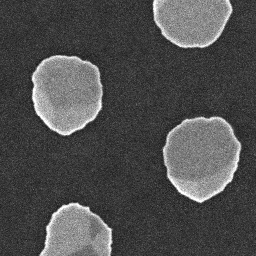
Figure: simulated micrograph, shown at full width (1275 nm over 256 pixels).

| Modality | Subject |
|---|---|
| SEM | raised bodies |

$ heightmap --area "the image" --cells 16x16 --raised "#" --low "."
..........####..
..........####..
...........##...
................
..####..........
..####..........
..####..........
...###......##..
...........####.
..........#####.
..........#####.
...........###..
............#...
...###..........
...####.........
...####.........